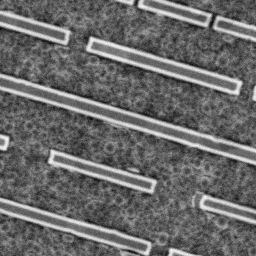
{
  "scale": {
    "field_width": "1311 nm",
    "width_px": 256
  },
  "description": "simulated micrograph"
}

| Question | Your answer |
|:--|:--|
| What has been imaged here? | parallel lines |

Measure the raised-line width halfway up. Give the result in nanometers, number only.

57.7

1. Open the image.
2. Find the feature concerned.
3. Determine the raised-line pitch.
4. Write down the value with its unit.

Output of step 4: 304 nm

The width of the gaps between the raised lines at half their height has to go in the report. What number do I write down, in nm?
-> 250